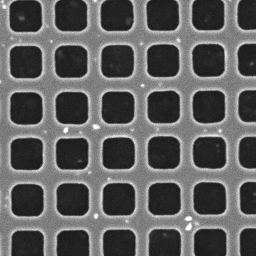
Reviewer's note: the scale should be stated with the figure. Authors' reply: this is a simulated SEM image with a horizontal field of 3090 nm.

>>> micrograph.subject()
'a regular array of holes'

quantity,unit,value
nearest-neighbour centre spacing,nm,547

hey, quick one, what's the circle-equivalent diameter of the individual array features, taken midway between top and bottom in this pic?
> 432 nm